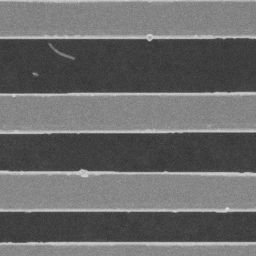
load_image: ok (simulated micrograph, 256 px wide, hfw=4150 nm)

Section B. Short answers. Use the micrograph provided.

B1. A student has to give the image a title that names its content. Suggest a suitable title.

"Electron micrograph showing lines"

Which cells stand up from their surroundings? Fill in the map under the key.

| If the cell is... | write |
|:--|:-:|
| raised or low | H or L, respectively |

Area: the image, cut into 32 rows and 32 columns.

HHHHHHHHHHHHHHHHHHHHHHHHHHHHHHHH
HHHHHHHHHHHHHHHHHHHHHHHHHHHHHHHH
HHHHHHHHHHHHHHHHHHHHHHHHHHHHHHHH
HHHHHHHHHHHHHHHHHHHHHHHHHHHHHHHH
HHHHHHHHHHHHHHHHHHHHHHHHHHHHHHHH
LLLLLLLLLLLLLLLLLLLLLLLLLLLLLLLL
LLLLLLLLLLLLLLLLLLLLLLLLLLLLLLLL
LLLLLLLLLLLLLLLLLLLLLLLLLLLLLLLL
LLLLLLLLLLLLLLLLLLLLLLLLLLLLLLLL
LLLLLLLLLLLLLLLLLLLLLLLLLLLLLLLL
LLLLLLLLLLLLLLLLLLLLLLLLLLLLLLLL
LLLLLLLLLLLLLLLLLLLLLLLLLLLLLLLL
HHHHHHHHHHHHHHHHHHHHHHHHHHHHHHHH
HHHHHHHHHHHHHHHHHHHHHHHHHHHHHHHH
HHHHHHHHHHHHHHHHHHHHHHHHHHHHHHHH
HHHHHHHHHHHHHHHHHHHHHHHHHHHHHHHH
HHHHHHHHHHHHHHHHHHHHLLLLLLLLLLLL
LLLLLLLLLLLLLLLLLLLLLLLLLLLLLLLL
LLLLLLLLLLLLLLLLLLLLLLLLLLLLLLLL
LLLLLLLLLLLLLLLLLLLLLLLLLLLLLLLL
LLLLLLLLLLLLLLLLLLLLLLLLLLLLLLLL
HHHHHHHHHHHLLLLLLLLLLLLLLLLLLLLL
HHHHHHHHHHHHHHHHHHHHHHHHHHHHHHHH
HHHHHHHHHHHHHHHHHHHHHHHHHHHHHHHH
HHHHHHHHHHHHHHHHHHHHHHHHHHHHHHHH
HHHHHHHHHHHHHHHHHHHHHHHHHHHHHHHH
LLLLLLLLLLLLLLLLLLLLLLLLLLLLLLLL
LLLLLLLLLLLLLLLLLLLLLLLLLLLLLLLL
LLLLLLLLLLLLLLLLLLLLLLLLLLLLLLLL
LLLLLLLLLLLLLLLLLLLLLLLLLLLLLLLL
HHHHHHHHHHHHHHHHHHHHHHHHHHHHHHHH
HHHHHHHHHHHHHHHHHHHHHHHHHHHHHHHH